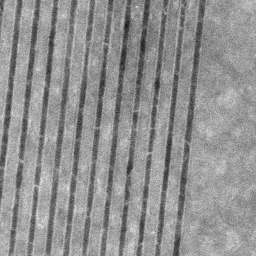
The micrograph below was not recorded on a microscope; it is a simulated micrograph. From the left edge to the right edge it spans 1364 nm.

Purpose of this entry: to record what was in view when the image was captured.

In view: parallel lines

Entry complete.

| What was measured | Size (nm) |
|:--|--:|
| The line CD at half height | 39.7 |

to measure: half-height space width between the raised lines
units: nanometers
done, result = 57.6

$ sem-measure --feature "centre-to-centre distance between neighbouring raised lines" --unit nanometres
97.3